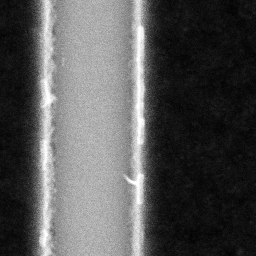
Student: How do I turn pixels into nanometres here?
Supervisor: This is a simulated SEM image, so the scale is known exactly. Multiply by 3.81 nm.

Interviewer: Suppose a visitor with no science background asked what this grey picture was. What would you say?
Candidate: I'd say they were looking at one or a few lines or trenches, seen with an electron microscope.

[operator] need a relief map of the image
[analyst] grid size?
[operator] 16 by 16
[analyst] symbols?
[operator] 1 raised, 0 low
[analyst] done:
1110000001111111
1110000011111111
1110000011111111
1110000011111111
1110000011111111
1110000011111111
1110000011111111
1110000011111111
1110000011111111
1110000011111111
1110000011111111
1110000011111111
1110000011111111
1110000011111111
1110000011111111
1110000011111111